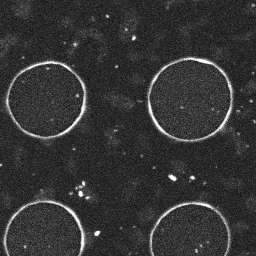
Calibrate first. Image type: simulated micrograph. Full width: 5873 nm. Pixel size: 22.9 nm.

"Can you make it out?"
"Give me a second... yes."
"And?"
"holes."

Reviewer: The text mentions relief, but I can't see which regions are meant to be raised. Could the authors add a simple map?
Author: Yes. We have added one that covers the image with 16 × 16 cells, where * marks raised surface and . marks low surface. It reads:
****************
****************
****************
****************
*...******....**
*....****.....**
*....****.....**
*....*****....**
**.********..***
****************
****************
****************
****************
*....*****....**
.....*****....**
.....****.....**